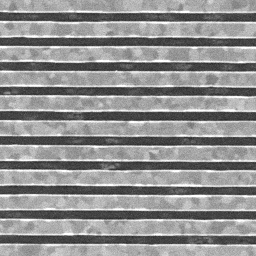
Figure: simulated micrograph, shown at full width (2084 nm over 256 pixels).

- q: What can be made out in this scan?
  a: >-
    parallel lines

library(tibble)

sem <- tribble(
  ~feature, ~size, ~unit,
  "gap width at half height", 81.4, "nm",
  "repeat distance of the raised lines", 201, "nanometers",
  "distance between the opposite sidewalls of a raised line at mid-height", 122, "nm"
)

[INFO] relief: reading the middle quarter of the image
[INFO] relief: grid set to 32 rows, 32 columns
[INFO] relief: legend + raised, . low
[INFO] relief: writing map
................................
................................
++++++++++++++++++++++++++++++++
++++++++++++++++++++++++++++++++
++++++++++++++++++++++++++++++++
.........................+++++++
................................
................................
++++++++++++++++++++++++++++++++
++++++++++++++++++++++++++++++++
++++++++++++++++++++++++++++++++
++++++++++++++++++++++++++++++++
................................
................................
++++++++++++++++++++++++........
++++++++++++++++++++++++++++++++
++++++++++++++++++++++++++++++++
++++++++++++++++++++++++++++++++
................................
................................
+++.+++.........................
++++++++++++++++++++++++++++++++
++++++++++++++++++++++++++++++++
++++++++++++++++++++++++++++++++
................................
................................
................................
++++++++++++++++++++++++++++++++
++++++++++++++++++++++++++++++++
++++++++++++++++++++++++++++++++
................................
................................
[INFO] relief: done